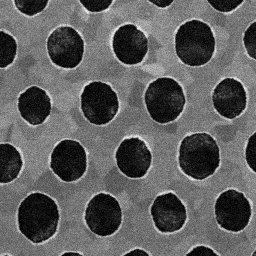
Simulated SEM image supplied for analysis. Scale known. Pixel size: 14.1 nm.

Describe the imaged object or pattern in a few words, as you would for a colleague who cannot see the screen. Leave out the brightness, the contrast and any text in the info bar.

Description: a regular array of holes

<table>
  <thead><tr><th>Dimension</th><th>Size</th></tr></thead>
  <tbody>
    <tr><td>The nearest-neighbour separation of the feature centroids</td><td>906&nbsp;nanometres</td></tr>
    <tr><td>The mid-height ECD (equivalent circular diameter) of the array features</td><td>562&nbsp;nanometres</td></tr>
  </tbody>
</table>